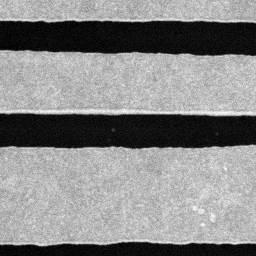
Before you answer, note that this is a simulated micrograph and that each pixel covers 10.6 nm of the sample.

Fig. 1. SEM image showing lines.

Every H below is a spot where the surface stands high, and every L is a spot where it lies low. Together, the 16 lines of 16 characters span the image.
HHHHHHHHHHHHHHHH
LLLLLLLLLLLLLLLL
LLLLLLLLLLLLLLLL
HHHHHHHHHHHHHLHH
HHHHHHHHHHHHHHHH
HHHHHHHHHHHHHHHH
HHHHHHHHHHHHHHHH
LLLLLLLLLLLLLLLL
LLLLLLLLLLLLLLLL
HHHHHHHHHHHHHHHH
HHHHHHHHHHHHHHHH
HHHHHHHHHHHHHHHH
HHHHHHHHHHHHHHHH
HHHHHHHHHHHHHHHH
HHHHHHHHHHHHHHHH
LLLLLLLLLLLLLLLL